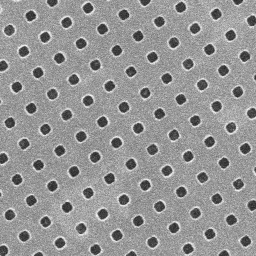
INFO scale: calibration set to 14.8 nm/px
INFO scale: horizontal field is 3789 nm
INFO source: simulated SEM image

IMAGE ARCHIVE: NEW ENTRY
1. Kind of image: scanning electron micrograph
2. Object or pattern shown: a regular array of holes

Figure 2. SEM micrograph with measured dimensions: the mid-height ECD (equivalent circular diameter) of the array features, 164 nm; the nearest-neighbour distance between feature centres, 25.4 pixels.